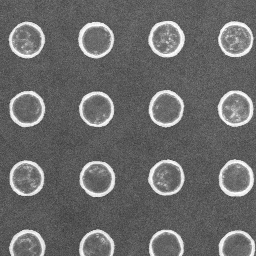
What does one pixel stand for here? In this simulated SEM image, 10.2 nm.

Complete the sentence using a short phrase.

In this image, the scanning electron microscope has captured a regular array of raised bodies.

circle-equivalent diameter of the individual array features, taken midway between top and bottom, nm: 337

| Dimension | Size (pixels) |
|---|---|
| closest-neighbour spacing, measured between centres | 69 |